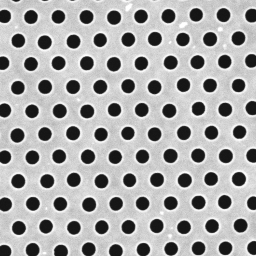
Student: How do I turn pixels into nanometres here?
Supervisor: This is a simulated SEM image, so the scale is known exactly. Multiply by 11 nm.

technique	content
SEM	a regular array of holes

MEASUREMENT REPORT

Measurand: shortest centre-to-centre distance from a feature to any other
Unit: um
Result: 0.29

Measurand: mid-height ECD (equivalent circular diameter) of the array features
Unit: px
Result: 14.2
